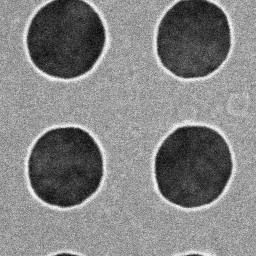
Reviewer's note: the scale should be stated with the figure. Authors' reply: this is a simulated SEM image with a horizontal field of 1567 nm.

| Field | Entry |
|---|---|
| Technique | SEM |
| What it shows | holes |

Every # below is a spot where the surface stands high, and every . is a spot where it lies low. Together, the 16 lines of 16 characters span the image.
###...#####...##
##....####....##
##.....###....##
##....####....##
###..######..###
################
################
################
###...#####...##
##....####....##
##....####.....#
##....####....##
###..#####...###
################
################
################